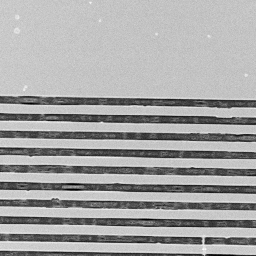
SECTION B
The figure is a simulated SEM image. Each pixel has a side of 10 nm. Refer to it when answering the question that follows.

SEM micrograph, parallel lines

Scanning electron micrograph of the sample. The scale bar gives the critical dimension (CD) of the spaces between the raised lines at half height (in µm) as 0.0839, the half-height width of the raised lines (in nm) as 92.6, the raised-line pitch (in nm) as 172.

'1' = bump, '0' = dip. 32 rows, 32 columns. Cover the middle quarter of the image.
11111111111111111111111111111111
11111111111111111111111111111111
11111111111111111111111111111111
11111111111111111111111111111111
11111111111111111111111111111111
11111111111111111111111111111111
11111111111111111111111111111111
11111111111111111111111111111111
00000000000000000000000000000011
00000000000000000000000000000000
11111111110000000110000000000000
11111111111111111111111111111111
00001111111111111111111111111111
00000000000000000000000000000000
00000000000000000000000000000000
11111111111111111111111111111111
11111111111111111111111111111111
00000000000000000000000000000000
00000000000000000000000000000000
11111111111111111111111111111111
11111111111111111111111111111111
00000000000000000000000000001111
00000000000000000000000000000000
11111111111111111111100000000000
11111111111111111111111111111111
00000000000000000111111111111111
00000000000000000000000000000000
00000000000000000000000000000000
11111111111111111111111111111111
11111111111111111111111111111111
00000000000000000000000000000000
00000000000000000000000000000000